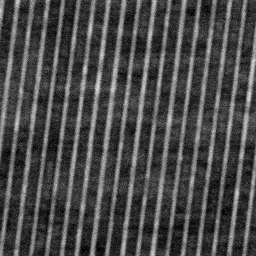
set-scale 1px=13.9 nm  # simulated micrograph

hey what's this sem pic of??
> parallel lines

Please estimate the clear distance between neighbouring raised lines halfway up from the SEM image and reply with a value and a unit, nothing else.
172 nanometers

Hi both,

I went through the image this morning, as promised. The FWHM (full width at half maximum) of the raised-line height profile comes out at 0.0396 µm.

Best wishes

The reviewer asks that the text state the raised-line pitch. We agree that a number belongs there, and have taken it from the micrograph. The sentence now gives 15.1 pixels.